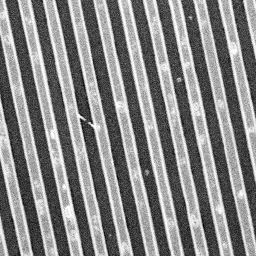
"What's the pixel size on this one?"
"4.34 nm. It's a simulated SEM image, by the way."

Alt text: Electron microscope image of parallel lines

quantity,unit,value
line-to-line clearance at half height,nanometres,58.7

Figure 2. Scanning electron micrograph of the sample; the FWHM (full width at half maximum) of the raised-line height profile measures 0.0462 microns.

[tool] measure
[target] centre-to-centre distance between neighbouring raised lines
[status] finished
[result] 106 nanometres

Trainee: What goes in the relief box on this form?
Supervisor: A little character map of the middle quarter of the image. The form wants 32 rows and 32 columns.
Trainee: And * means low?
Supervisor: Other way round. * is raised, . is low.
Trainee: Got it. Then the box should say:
*....**....***...***....**....**
*....**....***...***....**....**
*....***...***....**....***...**
**...***....**....***...***...**
**...***....**....***...***....*
**....**....***...***....**....*
**....**....***...***....**....*
**....***...***....**....***...*
***...***....**....***...***...*
***...***....**....***...***....
***....**....***...***....**....
.**....**....***...***....**....
.***...***...***....**....***...
.***...***....**....***...***...
.***...***....**....***...***...
.***...***....***...***....**...
..**....***...***...***....**...
..***...***...***....**....***..
..***...***....***...***...***..
..***...***....***...***...***..
...**....***...***...***....**..
...**....***...***...***....**..
...***...***...***....***...***.
...***...***....**....***...***.
...***...***....***...***...***.
....**....**....***...***....**.
....**....***...***...***....***
....***...***....**....***...***
*...***...***....**....***...***
*...***....**....***...***...***
*...***....***...***...***...***
*....**....***...***....**....**